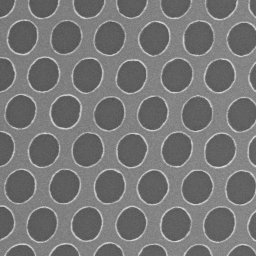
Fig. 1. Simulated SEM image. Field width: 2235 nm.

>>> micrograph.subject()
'a regular array of holes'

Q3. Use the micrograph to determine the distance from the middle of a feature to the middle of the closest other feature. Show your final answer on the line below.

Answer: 372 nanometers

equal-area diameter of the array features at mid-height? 282 nm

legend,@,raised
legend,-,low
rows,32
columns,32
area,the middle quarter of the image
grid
@@@------@@@@@------@@@@@-------
@@--------@@@@-------@@@@-------
@@--------@@@--------@@@--------
@@--------@@@--------@@@--------
@@-------@@@@-------@@@@--------
@@@------@@@@-------@@@@@------@
@@@@---@@@@@@@-----@@@@@@@----@@
@@@@@@@@@@@@@@@@@@@@@@@@@@@@@@@@
---@@@@@@@---@@@@@@@@---@@@@@@@@
----@@@@@-----@@@@@@-----@@@@@@-
----@@@@-------@@@@-------@@@@--
----@@@@-------@@@@-------@@@@--
----@@@--------@@@--------@@@---
----@@@@-------@@@--------@@@---
---@@@@@-------@@@@------@@@@@--
--@@@@@@------@@@@@-----@@@@@@--
@@@@@@@@@@--@@@@@@@@@--@@@@@@@@@
@@@@@--@@@@@@@@@--@@@@@@@@@---@@
@@@------@@@@@@-----@@@@@@-----@
@@@------@@@@@------@@@@@-------
@@--------@@@--------@@@@-------
@@--------@@@--------@@@--------
@@--------@@@--------@@@--------
@@-------@@@@@------@@@@@------@
@@@------@@@@@------@@@@@-----@@
@@@@---@@@@@@@@---@@@@@@@@@--@@@
-@@@@@@@@@---@@@@@@@@@-@@@@@@@@@
---@@@@@@-----@@@@@@-----@@@@@@-
----@@@@-------@@@@------@@@@@--
----@@@@-------@@@@-------@@@@--
----@@@@-------@@@--------@@@---
----@@@@-------@@@--------@@@---